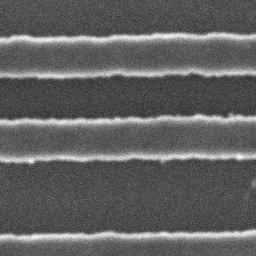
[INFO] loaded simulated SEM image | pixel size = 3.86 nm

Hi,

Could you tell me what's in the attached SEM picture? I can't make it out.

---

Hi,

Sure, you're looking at lines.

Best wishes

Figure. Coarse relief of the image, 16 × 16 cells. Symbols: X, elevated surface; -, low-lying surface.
----------------
----------------
XXXXXXXXXXXXXXXX
XXXXXXXXXXXXXXXX
XXXXXXXXXXXXXXXX
----------------
----------------
-X----XXXXXXXXXX
XXXXXXXXXXXXXXXX
XXXXXXXXXXXXXXXX
----------------
----------------
----------------
----------------
---------------X
XXXXXXXXXXXXXXXX